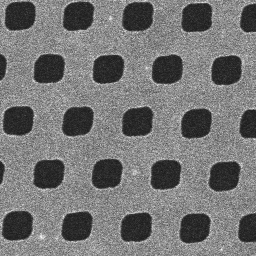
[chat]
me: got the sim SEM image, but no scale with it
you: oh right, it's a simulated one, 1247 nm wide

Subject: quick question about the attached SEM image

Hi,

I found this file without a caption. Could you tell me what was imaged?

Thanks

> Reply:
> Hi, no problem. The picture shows a regular array of holes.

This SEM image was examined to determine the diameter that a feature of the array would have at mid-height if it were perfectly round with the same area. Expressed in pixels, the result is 31.3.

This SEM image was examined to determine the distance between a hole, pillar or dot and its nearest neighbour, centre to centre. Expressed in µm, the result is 0.286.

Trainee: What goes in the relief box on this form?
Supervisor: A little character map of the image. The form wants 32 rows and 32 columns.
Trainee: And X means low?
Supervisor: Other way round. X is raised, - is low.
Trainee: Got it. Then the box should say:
X---XXXXX--XXXXX---XXXXX--XXXXX-
X---XXXX----XXX----XXXX---XXXX--
X---XXXX----XXX----XXXX---XXXX--
X---XXXX---XXXXX--XXXXX---XXXX--
XXXXXXXXXXXXXXXXXXXXXXXXXXXXXXXX
XXXXXXXXXXXXXXXXXXXXXXXXXXXXXXXX
XXXXXXXXXXXXXXXXXXXXXXXXXXXXXXXX
-XXXX---XXXX---XXXX----XXXX---XX
-XXX----XXXX---XXXX----XXX----XX
XXXX----XXXX---XXXX----XXX----XX
XXXXXXXXXXXXXXXXXXXXXXXXXXX--XXX
XXXXXXXXXXXXXXXXXXXXXXXXXXXXXXXX
XXXXXXXXXXXXXXXXXXXXXXXXXXXXXXXX
X---XXXXX--XXXXXXXXXXXXXXXXXXXXX
X---XXXX----XXX----XXXX---XXXX--
----XXXX---XXXX----XXXX---XXXX--
X---XXXX---XXXX----XXXX---XXXX--
XXXXXXXXXXXXXXXXXXXXXXXXXXXXXXXX
XXXXXXXXXXXXXXXXXXXXXXXXXXXXXXXX
XXXXXXXXXXXXXXXXXXXXXXXXXXXXXXXX
XXXXX---XXXX---XXXX---XXXXX---XX
XXXX----XXXX---XXXX----XXX----XX
XXXX----XXXX---XXXX---XXXX----XX
XXXXX--XXXXX-XXXXXX---XXXX---XXX
XXXXXXXXXXXXXXXXXXXXXXXXXXXXXXXX
XXXXXXXXXXXXXXXXXXXXXXXXXXXXXXXX
X--XXXXXXX-XXXXXXXXXXXXXXXXXXXXX
----XXXX---XXXX----XXXX---XXXX--
----XXXX---XXXX----XXXX---XXXX--
----XXXX---XXXX----XXX----XXXX--
XXXXXXXXXXXXXXXXXXXXXXXXXXXXXXXX
XXXXXXXXXXXXXXXXXXXXXXXXXXXXXXXX